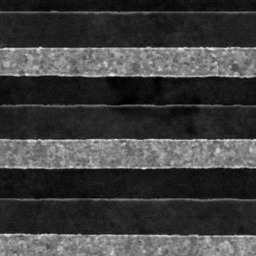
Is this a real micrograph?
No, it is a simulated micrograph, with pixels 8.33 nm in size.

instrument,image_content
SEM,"lines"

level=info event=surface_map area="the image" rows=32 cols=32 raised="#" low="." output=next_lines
................................
......#.........................
################################
################################
################################
################################
################################
################################
################################
..........###.....#.######..####
................................
................................
................................
################################
################################
################################
################################
################################
################################
################################
################################
................................
................................
................................
................................
################################
################################
################################
################################
################################
################################
################################